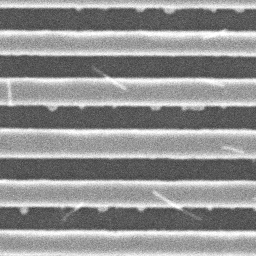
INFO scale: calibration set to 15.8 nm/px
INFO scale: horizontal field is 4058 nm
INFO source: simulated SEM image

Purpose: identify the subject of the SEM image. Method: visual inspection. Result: lines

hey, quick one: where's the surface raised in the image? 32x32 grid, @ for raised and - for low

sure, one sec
@@@@@@@@@@@@@@@@@@@@@@@@@@@@@@@@
--------------------------------
--------------------------------
--------------------------------
@@@@@@@@@@@@@@@@@@@@@@@@@@@@@@@@
@@@@@@@@@@@@@@@@@@@@@@@@@@@@@@@@
@@@@@@@@@@@@@@@@@@@@@@@@@@@@@@@@
--------------------------------
--------------------------------
--------------------------------
@@@@@@@@@@@@@@@@@@@@@@@@@@@@@@@@
@@@@@@@@@@@@@@@@@@@@@@@@@@@@@@@@
@@@@@@@@@@@@@@@@@@@@@@@@@@@@@@@@
--------------------------------
--------------------------------
--------------------------------
@@@@@@@@@@@@@@@@@@@@@@@@@@@@@@@@
@@@@@@@@@@@@@@@@@@@@@@@@@@@@@@@@
@@@@@@@@@@@@@@@@@@@@@@@@@@@@@@@@
@@@@@@@@@@@@@@@@@@@@@@@@@@@@@@@@
--------------------------------
--------------------------------
--------------------------------
@@@@@@@@@@@@@@@@@@@@@@@@@@@@@@@@
@@@@@@@@@@@@@@@@@@@@@@@@@@@@@@@@
@@@@@@@@@@@@@@@@@@@@@@@@@@@@@@@@
--------------------------------
--------------------------------
--------------------------------
@@@@@@@@@@@@@@@@@@@@@@@@@@@@@@@@
@@@@@@@@@@@@@@@@@@@@@@@@@@@@@@@@
@@@@@@@@@@@@@@@@@@@@@@@@@@@@@@@@